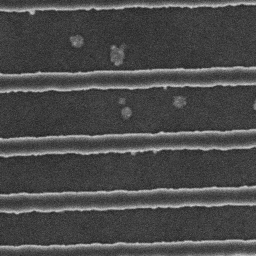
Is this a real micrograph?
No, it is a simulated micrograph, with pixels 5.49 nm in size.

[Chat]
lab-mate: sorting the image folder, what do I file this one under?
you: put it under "lines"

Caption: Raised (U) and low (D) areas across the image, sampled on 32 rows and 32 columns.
UUUUUUUUUUUUUUUUUUUUUUUUUUUUUUUU
DDDDDDDDDDDDDDDDDDDDDDDDDDDDDDDD
DDDDDDDDDDDDDDDDDDDDDDDDDDDDDDDD
DDDDDDDDDDDDDDDDDDDDDDDDDDDDDDDD
DDDDDDDDDDDDDDDDDDDDDDDDDDDDDDDD
DDDDDDDDDDDDDDDDDDDDDDDDDDDDDDDD
DDDDDDDDDDDDDDDDDDDDDDDDDDDDDDDD
DDDDDDDDDDDDDDDDDDDDDDDDDDDDDDDD
DDDDDDDDDDDDDDDDDDDDDDDDDDDDDUUU
UUUUUUUUUUUUUUUUUUUUUUUUUUUUUUUU
UUUUUUUUUUUUUUUUUUUUUUUUUUUUUUUU
UDDDDDDDDDDDDDDDDDDDDDDDDDDDDDDD
DDDDDDDDDDDDDDDDDDDDDDDDDDDDDDDD
DDDDDDDDDDDDDDDDDDDDDDDDDDDDDDDD
DDDDDDDDDDDDDDDDDDDDDDDDDDDDDDDD
DDDDDDDDDDDDDDDDDDDDDDDDDDDDDDDD
DDDDDDDDDDDDDDDDDDDDDDDDUUUUUUUU
UUUUUUUUUUUUUUUUUUUUUUUUUUUUUUUU
UUUUUUUUUUUUUUUUUUUUUUUUUUUUUDDD
UDDDDDDDDDDDDDDDDDDDDDDDDDDDDDDD
DDDDDDDDDDDDDDDDDDDDDDDDDDDDDDDD
DDDDDDDDDDDDDDDDDDDDDDDDDDDDDDDD
DDDDDDDDDDDDDDDDDDDDDDDDDDDDDDDD
DDDDDDDDDDDDDDDDDDDDDDDDDDUDDDUU
UUUUUUUUUUUUUUUUUUUUUUUUUUUUUUUU
UUUUUUUUUUUUUUUUUUUUUUUUUUUUUUUU
UUUDDDDDDDDDDDDDDDDDDDDDDDDDDDDD
DDDDDDDDDDDDDDDDDDDDDDDDDDDDDDDD
DDDDDDDDDDDDDDDDDDDDDDDDDDDDDDDD
DDDDDDDDDDDDDDDDDDDDDDDDDDDDDDDD
DDDDDDDDDDDUUDUUUUUUUUUUUUUUUUUU
UUUUUUUUUUUUUUUUUUUUUUUUUUUUUUUU